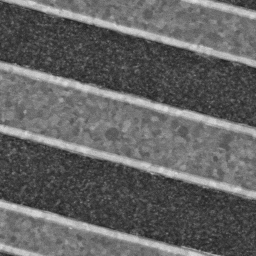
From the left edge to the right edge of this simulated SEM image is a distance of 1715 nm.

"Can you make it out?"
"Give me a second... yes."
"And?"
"one or a few lines or trenches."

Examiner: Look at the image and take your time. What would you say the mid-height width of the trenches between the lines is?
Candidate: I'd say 0.456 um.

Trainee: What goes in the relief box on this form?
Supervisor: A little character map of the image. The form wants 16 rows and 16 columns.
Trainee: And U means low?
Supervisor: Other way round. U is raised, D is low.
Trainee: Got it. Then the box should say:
DDDUUUUUUUUUUUDD
DDDDDDDUUUUUUUUU
DDDDDDDDDDDUUUUU
DDDDDDDDDDDDDDUU
UUDDDDDDDDDDDDDD
UUUUUDDDDDDDDDDD
UUUUUUUUUDDDDDDD
UUUUUUUUUUUUUDDD
DDUUUUUUUUUUUUUU
DDDDDDUUUUUUUUUU
DDDDDDDDDUUUUUUU
DDDDDDDDDDDDDUUU
DDDDDDDDDDDDDDDD
UUUDDDDDDDDDDDDD
UUUUUUUDDDDDDDDD
UUUUUUUUUUDDDDDD